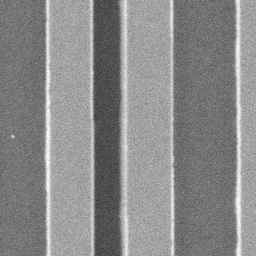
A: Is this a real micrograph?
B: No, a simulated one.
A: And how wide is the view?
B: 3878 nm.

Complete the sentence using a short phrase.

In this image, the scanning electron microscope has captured lines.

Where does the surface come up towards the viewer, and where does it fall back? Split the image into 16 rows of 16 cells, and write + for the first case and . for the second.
...+++..+++....+
...+++..+++....+
...+++..+++....+
...+++..+++....+
...+++..+++....+
...+++..+++....+
...+++..+++....+
...+++..+++....+
...+++..+++....+
...+++..+++....+
...+++..+++....+
...+++..+++....+
...+++..+++....+
...+++..+++....+
...+++..+++....+
...+++..+++....+